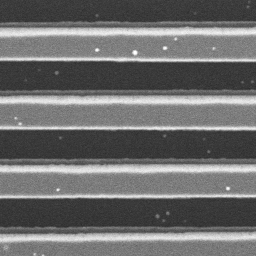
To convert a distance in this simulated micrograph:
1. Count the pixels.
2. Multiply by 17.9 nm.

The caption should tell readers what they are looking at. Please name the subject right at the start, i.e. lines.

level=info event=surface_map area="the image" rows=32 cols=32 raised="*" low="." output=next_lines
................................
................................
................................
..................******..**...*
********************************
********************************
********************************
........**....******************
................................
................................
................................
................................
********************************
********************************
********************************
********************************
................................
................................
................................
................................
................................
********************************
********************************
********************************
********************************
................................
................................
................................
................................
********************************
********************************
********************************